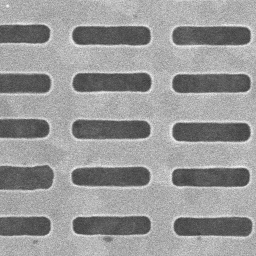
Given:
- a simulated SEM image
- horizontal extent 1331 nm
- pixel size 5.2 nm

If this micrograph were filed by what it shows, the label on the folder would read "a regular array of holes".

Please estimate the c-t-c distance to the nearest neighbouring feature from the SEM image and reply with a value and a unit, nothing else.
244 nm